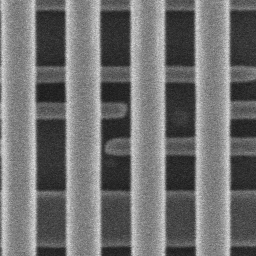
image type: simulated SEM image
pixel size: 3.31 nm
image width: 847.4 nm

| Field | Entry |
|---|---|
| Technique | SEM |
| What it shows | wiring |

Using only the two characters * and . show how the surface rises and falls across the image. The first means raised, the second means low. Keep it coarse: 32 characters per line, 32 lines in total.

****....****....*****....****...
****....****....*****....****...
****....****....*****....****...
****....****....*****...*****...
****....****....*****...*****...
****....****....*****...*****...
****....****....*****....****...
****....****....*****....****...
****....****....*****....****...
****....****....*****....****...
****....****....*****....****...
****....****....*****....****...
****....****....*****....****...
****....****....*****....****...
****....****....*****....****...
****....****....*****....****...
****....****....*****....****...
****....****....*****....****...
****....****....*****....****...
****....****....*****....****...
****....****....*****....****...
****....****....*****....****...
****....****....*****....****...
****....****....*****....****...
****....****....*****....****...
****....****....*****....****...
****....****....*****....****...
****....****....*****....****...
****....****.....****....****...
****....****.....****....****...
****....****.....****....****...
****....****.....****....****...